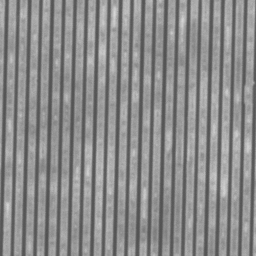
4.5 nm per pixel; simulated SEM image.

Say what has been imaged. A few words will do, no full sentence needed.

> parallel lines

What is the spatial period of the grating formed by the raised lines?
51.1 nm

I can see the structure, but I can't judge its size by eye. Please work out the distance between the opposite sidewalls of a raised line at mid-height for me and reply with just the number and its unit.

32.6 nm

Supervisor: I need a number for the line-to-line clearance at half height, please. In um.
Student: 0.0202